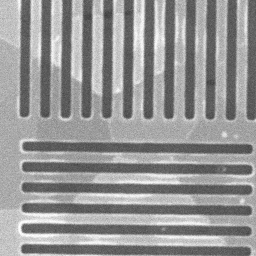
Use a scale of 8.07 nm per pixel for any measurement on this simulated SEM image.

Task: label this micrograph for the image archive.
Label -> groups of lines, slits or small figures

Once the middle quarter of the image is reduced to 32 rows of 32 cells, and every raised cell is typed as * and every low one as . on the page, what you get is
..**...**...***..***...**...**..
..**...**...***..***...**...**..
..**...**...***..***...**...**..
..**...**...***..***...**...**..
..**...**...***..***...**...**..
..**...**...***..***...**...**..
..**...**...***..***...**...**..
..**...**...***..***...**...**..
..**...**...***..***...**...**..
..**...**...***..***...**...**..
..**...**...***..***...**...**..
..**...**...***..***...**...**..
..**...**...***..***...**...**..
.****.****..***..***..***..***..
********************************
********************************
********************************
********************************
********************************
.............*******************
................................
................................
**********....****..............
********************************
...*****************************
................................
................................
************....................
********************************
...************...**************
................................
................................